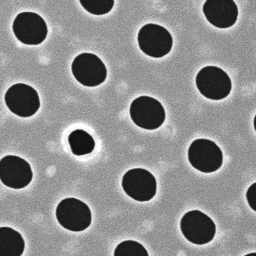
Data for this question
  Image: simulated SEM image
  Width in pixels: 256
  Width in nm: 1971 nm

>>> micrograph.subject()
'a regular array of holes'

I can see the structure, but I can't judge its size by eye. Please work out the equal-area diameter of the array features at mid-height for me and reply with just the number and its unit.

268 nm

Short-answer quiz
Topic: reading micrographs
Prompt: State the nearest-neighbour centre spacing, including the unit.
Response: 555 nanometres